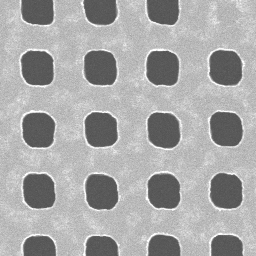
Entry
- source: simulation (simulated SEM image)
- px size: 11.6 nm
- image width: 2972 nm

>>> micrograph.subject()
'a regular array of holes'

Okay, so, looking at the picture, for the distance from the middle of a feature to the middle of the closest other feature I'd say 61.4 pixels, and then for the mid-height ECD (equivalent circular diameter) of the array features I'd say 409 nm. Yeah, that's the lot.